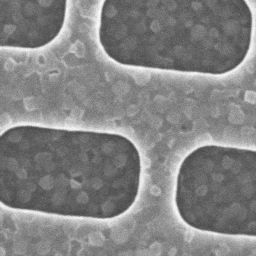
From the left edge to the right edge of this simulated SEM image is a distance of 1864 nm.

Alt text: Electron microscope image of holes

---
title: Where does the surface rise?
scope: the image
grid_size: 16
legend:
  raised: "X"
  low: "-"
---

----XX----------
----XX----------
---XXX----------
XXXXXXX--------X
XXXXXXXXXXXX--XX
XXXXXXXXXXXXXXXX
XXXXXXXXXXXXXXXX
XXXXXXXXXXXXXXXX
--------XXXXXXXX
---------XXX----
---------XX-----
---------XX-----
--------XXX-----
XXXX---XXXX-----
XXXXXXXXXXXXX---
XXXXXXXXXXXXXXXX